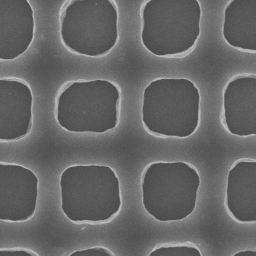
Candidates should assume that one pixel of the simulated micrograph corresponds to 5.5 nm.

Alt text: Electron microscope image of holes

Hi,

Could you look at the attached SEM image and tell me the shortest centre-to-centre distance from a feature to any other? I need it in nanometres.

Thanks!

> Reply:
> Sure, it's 447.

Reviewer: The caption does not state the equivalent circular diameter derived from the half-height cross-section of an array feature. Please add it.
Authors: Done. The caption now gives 331 nanometres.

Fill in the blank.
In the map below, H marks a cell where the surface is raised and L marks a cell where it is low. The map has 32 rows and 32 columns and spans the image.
LLLLHHHHHLLLLLHHHHLLLLLLLHHHHLLL
LLLLHHHHLLLLLLLHHHLLLLLLLHHHLLLL
LLLLHHHHLLLLLLLHHHLLLLLLLHHHLLLL
LLLLHHHHLLLLLLLHHHLLLLLLLHHHLLLL
LLLLHHHHLLLLLLLHHHLLLLLLLHHHLLLL
LLLLHHHHLLLLLLHHHHLLLLLLHHHHHLLL
LLLHHHHHHLLLLLHHHHHLLLLHHHHHHHHH
HHHHHHHHHHHHHHHHHHHHHHHHHHHHHHHH
HHHHHHHHHHHHHHHHHHHHHHHHHHHHHHHH
HHHHHHHHHHHHHHHHHHHHHHHHHHHHHHLL
LLLHHHHHHLLLLLHHHHHLLLLLHHHHHLLL
LLLLHHHHLLLLLLLHHHLLLLLLLHHHLLLL
LLLLHHHLLLLLLLLHHHLLLLLLLHHHLLLL
LLLLHHHLLLLLLLLHHHLLLLLLLHHHLLLL
LLLLHHHLLLLLLLLHHHLLLLLLLHHHLLLL
LLLLHHHHLLLLLLLHHHLLLLLLLHHHLLLL
LLLLHHHHHHHHHHHHHHHLLLLLHHHHHLLL
LLHHHHHHHHHHHHHHHHHHHHHHHHHHHHHH
HHHHHHHHHHHHHHHHHHHHHHHHHHHHHHHH
HHHHHHHHHHHHHHHHHHHHHHHHHHHHHHHH
HHHHHHHHHHHHHHHHHHHLLLLHHHHHHHLL
LLLLHHHHLLLLLLHHHHLLLLLLHHHHHLLL
LLLLLHHHLLLLLLLHHHLLLLLLLHHHLLLL
LLLLLHHHLLLLLLLHHHLLLLLLLHHHLLLL
LLLLLHHHLLLLLLLHHHLLLLLLLHHHLLLL
LLLLHHHHLLLLLLLHHHLLLLLLHHHHLLLL
LLLLHHHHLLLLLLLHHHHLLLLLHHHHHLLL
HLLHHHHHHLLLLHHHHHHHLLHHHHHHHHLL
HHHHHHHHHHHHHHHHHHHHHHHHHHHHHHHH
HHHHHHHHHHHHHHHHHHHHHHHHHHHHHHHH
HHHHHHHHHHHHHHHHHHHHHHHHHHHHHHHH
LLLLHHHHHLLLLLHHHHHLLLLLLHHHHHLL